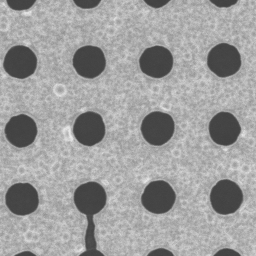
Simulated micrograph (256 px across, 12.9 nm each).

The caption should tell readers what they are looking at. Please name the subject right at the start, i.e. a regular array of holes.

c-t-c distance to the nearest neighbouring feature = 871 nanometres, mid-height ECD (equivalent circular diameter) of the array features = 433 nanometres